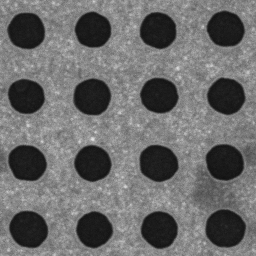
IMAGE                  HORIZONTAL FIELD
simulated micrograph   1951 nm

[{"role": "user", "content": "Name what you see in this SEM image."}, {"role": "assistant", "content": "a regular array of holes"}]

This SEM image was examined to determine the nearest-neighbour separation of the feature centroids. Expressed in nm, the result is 498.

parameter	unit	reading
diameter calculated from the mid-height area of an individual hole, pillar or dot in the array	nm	282